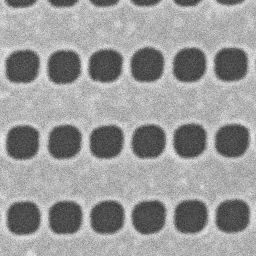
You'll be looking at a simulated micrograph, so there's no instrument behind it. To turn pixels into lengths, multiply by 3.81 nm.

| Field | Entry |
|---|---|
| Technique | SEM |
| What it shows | a regular array of holes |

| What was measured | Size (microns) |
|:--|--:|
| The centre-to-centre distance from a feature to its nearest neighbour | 0.159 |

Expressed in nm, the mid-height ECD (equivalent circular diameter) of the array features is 138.